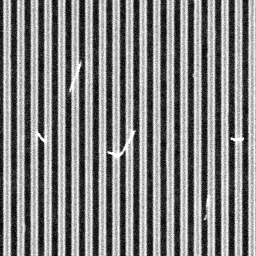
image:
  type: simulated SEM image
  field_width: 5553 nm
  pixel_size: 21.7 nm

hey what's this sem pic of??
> parallel lines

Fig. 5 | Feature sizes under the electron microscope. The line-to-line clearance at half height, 0.173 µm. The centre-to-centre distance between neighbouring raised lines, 295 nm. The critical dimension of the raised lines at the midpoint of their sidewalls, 133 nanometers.